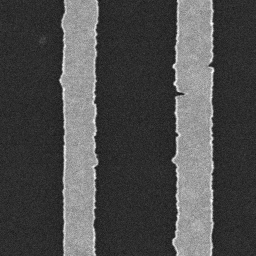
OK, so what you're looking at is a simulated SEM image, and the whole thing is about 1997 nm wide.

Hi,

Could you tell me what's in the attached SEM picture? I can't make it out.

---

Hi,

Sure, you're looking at one or a few lines or trenches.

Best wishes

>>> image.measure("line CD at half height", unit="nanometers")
264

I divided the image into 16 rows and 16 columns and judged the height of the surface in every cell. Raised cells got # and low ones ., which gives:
....##.....##...
....##.....##...
....##.....##...
....##.....##...
....##.....##...
....##.....##...
....##.....##...
....##.....##...
....##.....##...
....##.....##...
....##.....##...
....##.....##...
....##.....##...
....##.....##...
....##.....##...
....##.....##...